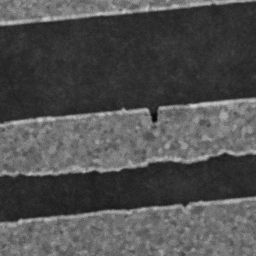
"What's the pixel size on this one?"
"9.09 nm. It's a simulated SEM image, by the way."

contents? one or a few lines or trenches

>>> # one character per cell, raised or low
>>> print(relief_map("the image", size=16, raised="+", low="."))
+++++++++++.....
................
................
................
................
................
.............+++
..++++++++++++++
++++++++++++++++
++++++++++++++++
++++++++........
................
...............+
.....+++++++++++
++++++++++++++++
++++++++++++++++